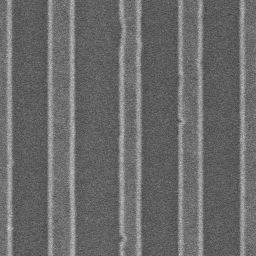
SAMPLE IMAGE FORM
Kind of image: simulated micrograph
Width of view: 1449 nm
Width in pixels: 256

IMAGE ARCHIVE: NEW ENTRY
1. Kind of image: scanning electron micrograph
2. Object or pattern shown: one or a few lines or trenches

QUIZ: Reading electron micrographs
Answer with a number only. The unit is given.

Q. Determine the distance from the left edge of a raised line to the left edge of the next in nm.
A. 365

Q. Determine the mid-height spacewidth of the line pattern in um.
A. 0.231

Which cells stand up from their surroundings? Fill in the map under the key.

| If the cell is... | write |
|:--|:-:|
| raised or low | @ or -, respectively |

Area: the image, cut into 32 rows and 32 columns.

@-----@@@------@@------@@-----@@
@-----@@@------@@------@@-----@@
@-----@@@------@@------@@-----@@
@-----@@@------@@------@@-----@@
@-----@@@------@@------@@-----@@
@-----@@@------@@------@@-----@@
@-----@@@------@@------@@-----@@
@-----@@@------@@------@@-----@@
@-----@@@------@@------@@-----@@
@-----@@@------@@------@@-----@@
@-----@@@------@@------@@-----@@
@-----@@@------@@------@@-----@@
@-----@@@------@@------@@-----@@
@-----@@@------@@------@@-----@@
@-----@@@------@@------@@-----@@
@-----@@@------@@------@@-----@@
@-----@@@------@@------@@-----@@
@-----@@@------@@------@@-----@@
@-----@@@------@@------@@-----@@
@-----@@@------@@------@@-----@@
@-----@@@------@@------@@-----@@
@-----@@@------@@------@@-----@@
@-----@@@------@@------@@-----@@
@-----@@@------@@------@@-----@@
@-----@@@------@@------@@-----@@
@-----@@@------@@------@@-----@@
@-----@@@------@@------@@-----@@
@-----@@@------@@------@@-----@@
@-----@@@------@@------@@-----@@
@-----@@@------@@------@@-----@@
@-----@@@------@@------@@-----@@
@-----@@@------@@------@@-----@@